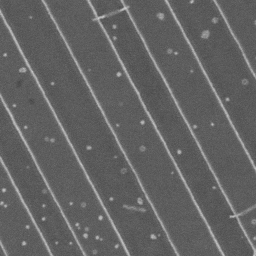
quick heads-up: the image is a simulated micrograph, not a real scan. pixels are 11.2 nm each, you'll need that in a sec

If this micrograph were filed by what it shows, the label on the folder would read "lines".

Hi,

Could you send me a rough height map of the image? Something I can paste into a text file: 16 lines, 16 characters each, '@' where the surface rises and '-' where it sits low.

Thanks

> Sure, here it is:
---@@@--@@@---@@
---@@@--@@@---@@
@---@@@--@@@---@
@----@@--@@@---@
@@---@@@--@@@---
@@@---@@---@@---
@@@---@@@--@@@--
-@@@---@@@--@@--
-@@@---@@@--@@@-
--@@@---@@@--@@-
--@@@---@@@--@@@
@--@@@---@@@--@@
@--@@@---@@@--@@
@@--@@@---@@@--@
@@@-@@@---@@@--@
@@@--@@@---@@@--